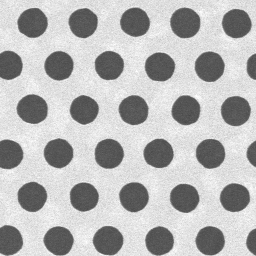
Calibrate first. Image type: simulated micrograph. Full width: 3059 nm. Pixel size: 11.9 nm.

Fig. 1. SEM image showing a regular array of holes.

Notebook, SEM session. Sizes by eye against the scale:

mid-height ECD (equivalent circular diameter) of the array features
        354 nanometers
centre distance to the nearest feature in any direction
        595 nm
